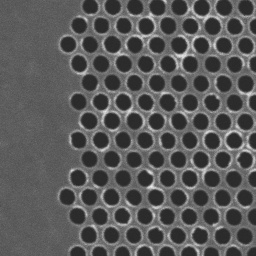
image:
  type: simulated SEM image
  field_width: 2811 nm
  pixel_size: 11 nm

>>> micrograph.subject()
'a regular array of holes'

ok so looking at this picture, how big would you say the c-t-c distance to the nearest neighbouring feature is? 0.24 microns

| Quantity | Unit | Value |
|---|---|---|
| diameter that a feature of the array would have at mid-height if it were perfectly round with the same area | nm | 182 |